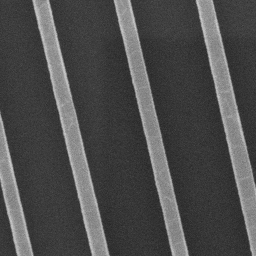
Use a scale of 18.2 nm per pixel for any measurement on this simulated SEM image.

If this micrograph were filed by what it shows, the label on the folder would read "lines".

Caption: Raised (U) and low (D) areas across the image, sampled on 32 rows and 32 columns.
DDDDUUDDDDDDDDUUDDDDDDDDDUUDDDDD
DDDDUUDDDDDDDDDUUDDDDDDDDUUDDDDD
DDDDDUUDDDDDDDDUUDDDDDDDDUUDDDDD
DDDDDUUDDDDDDDDUUDDDDDDDDUUDDDDD
DDDDDUUDDDDDDDDUUDDDDDDDDDUUDDDD
DDDDDUUDDDDDDDDDUDDDDDDDDDUUDDDD
DDDDDDUUDDDDDDDDUUDDDDDDDDUUDDDD
DDDDDDUUDDDDDDDDUUDDDDDDDDUUDDDD
DDDDDDUUDDDDDDDDUUDDDDDDDDUUDDDD
DDDDDDUUDDDDDDDDUUDDDDDDDDDUUDDD
DDDDDDDUUDDDDDDDDUUDDDDDDDDUUDDD
DDDDDDDUUDDDDDDDDUUDDDDDDDDUUDDD
DDDDDDDUUDDDDDDDDUUDDDDDDDDUUDDD
DDDDDDDUUDDDDDDDDUUDDDDDDDDUUUDD
DDDDDDDUUDDDDDDDDDUDDDDDDDDDUUDD
DDDDDDDDUUDDDDDDDDUUDDDDDDDDUUDD
UDDDDDDDUUDDDDDDDDUUDDDDDDDDUUDD
UDDDDDDDUUDDDDDDDDUUDDDDDDDDUUDD
UDDDDDDDUUDDDDDDDDDUDDDDDDDDDUUD
UDDDDDDDDUUDDDDDDDDUUDDDDDDDDUUD
UDDDDDDDDUUDDDDDDDDUUDDDDDDDDUUD
UUDDDDDDDUUDDDDDDDDUUDDDDDDDDUUD
UUDDDDDDDUUDDDDDDDDUUDDDDDDDDDUU
UUDDDDDDDDUUDDDDDDDDUUDDDDDDDDUU
UUDDDDDDDDUUDDDDDDDDUUDDDDDDDDUU
DUUDDDDDDDUUDDDDDDDDUUDDDDDDDDUU
DUUDDDDDDDUUDDDDDDDDUUDDDDDDDDUU
DUUDDDDDDDUUUDDDDDDDDUDDDDDDDDDU
DUUDDDDDDDDUUDDDDDDDDUUDDDDDDDDU
DDUUDDDDDDDUUDDDDDDDDUUDDDDDDDDU
DDUUDDDDDDDUUDDDDDDDDUUDDDDDDDDU
DDUUDDDDDDDUUDDDDDDDDUUDDDDDDDDU